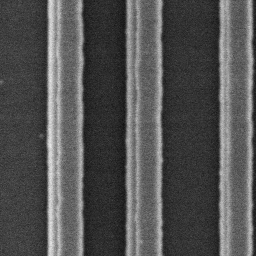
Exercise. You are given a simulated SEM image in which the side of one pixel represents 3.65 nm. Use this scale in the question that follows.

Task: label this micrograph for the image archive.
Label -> lines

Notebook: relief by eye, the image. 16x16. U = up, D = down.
DDDUUDDDUUDDDDUU
DDDUUDDDUUDDDDUU
DDDUUDDDUUDDDDUU
DDDUUDDDUUDDDDUU
DDDUUDDDUUDDDDUU
DDDUUDDDUUDDDDUU
DDDUUDDDUUDDDDUU
DDDUUDDDUUDDDDUU
DDDUUDDDUUDDDDUU
DDDUUDDDUUDDDDUU
DDDUUDDDUUDDDDUU
DDDUUDDDUUDDDDUU
DDDUUDDDUUDDDDUU
DDDUUDDDUUDDDDUU
DDDUUDDDUUDDDDUU
DDDUUDDDUUDDDDUU